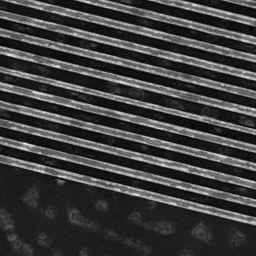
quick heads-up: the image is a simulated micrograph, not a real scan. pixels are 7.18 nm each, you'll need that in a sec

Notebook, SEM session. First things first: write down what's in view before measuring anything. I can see parallel lines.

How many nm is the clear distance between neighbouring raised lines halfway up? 75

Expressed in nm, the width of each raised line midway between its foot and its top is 49.7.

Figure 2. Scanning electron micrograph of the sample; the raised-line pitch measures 17.5 px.